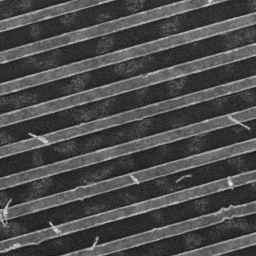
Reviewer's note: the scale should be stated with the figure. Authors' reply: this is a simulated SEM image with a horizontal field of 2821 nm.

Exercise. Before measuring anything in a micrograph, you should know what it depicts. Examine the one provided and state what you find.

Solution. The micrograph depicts parallel lines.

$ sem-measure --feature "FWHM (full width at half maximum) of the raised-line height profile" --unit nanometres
115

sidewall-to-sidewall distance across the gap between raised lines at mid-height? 222 nm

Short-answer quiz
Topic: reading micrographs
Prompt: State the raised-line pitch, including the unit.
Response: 334 nm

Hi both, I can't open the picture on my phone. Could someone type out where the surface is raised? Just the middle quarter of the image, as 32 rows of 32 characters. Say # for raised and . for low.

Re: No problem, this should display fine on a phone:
##########..................####
######..................########
###...................#########.
.................###########....
..............##########........
...........#########............
.......##########...............
...##########...................
##########..................####
######...................#######
###..................##########.
..................#########.....
..............#########.........
...........#########............
.......#########................
...#########...................#
#########..................#####
#####...................########
##..................##########..
.................#########......
.............##########.........
.........##########.............
......##########................
..##########...................#
########...................#####
#####...................########
#...................##########..
.................#########......
.............##########.........
.........##########.............
......#########.................
..##########...................#